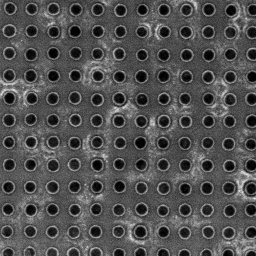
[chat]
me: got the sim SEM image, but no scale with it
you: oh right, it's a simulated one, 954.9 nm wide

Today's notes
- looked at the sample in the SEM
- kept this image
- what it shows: a regular array of raised bodies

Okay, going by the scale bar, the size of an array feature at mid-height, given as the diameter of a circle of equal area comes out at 46.7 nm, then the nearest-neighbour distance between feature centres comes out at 80.3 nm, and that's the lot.